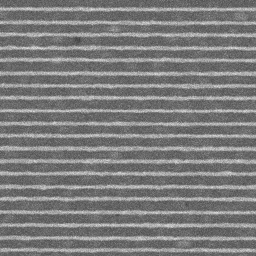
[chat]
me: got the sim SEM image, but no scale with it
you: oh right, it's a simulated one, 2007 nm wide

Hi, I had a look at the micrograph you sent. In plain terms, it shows parallel lines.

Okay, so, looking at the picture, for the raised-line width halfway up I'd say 2.63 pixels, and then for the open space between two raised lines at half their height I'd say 78.4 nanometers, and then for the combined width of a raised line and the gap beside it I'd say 99.5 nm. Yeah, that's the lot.